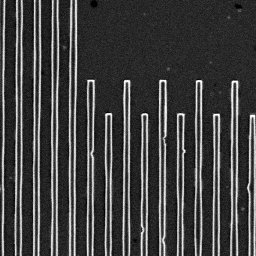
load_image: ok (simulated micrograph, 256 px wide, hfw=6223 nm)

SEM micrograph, parallel lines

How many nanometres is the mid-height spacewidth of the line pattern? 307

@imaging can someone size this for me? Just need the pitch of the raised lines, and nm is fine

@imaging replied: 437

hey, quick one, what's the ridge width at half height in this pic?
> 131 nm